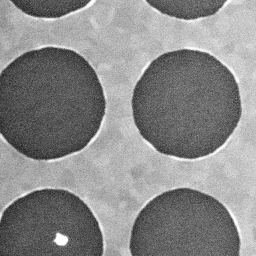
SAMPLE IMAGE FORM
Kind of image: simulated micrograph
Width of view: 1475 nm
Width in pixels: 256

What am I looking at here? holes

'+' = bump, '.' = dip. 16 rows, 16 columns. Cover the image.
+....+++++....++
++++++++++++++++
++++++++++++++++
+....+++++...+++
......+++.....++
......++.......+
.......+.......+
......++.......+
......+++.....++
+....+++++...+++
++++++++++++++++
++++++++++++++++
+....++++.....++
......+++.....++
......++.......+
......++.......+